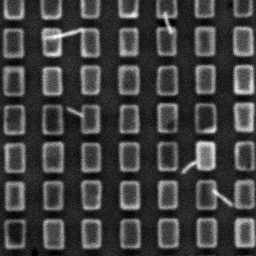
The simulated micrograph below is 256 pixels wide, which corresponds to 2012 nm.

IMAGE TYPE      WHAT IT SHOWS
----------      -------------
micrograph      wiring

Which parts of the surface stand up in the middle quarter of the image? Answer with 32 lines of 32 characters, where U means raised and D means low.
DDDDDDDDDDDDDDDDDDDDDDDDDDDDDDDD
DDDDDUUUUDDDDDUUUUUDDDDDUUUUDDDD
DDDDDUUUUDDDDDUUUUUDDDDDUUUUDDDD
DDDDDUUUUDDDDDUUUUUDDDDUUUUUDDDD
DDDDDUUUUDDDDDUUUUUDDDDUUUUUDDDD
DDDDDUUUUDDDDDUUUUUDDDDUUUUUDDDD
DDDDDUUUUDDDDDUUUUUDDDDUUUUUDDDD
DDDDDDDDDDDDDDDDDDDDDDDDUUUUDDDD
DDDDDDDDDDDDDDDDDDDDDDDDDDDDDDDD
DDDDDDDDDDDDDDDDDDDDDDDDDDDDDDDD
DDDDDUUUDDDDDDDUUUDDDDDDUUUUDDDD
DDDDDUUUUDDDDDUUUUDDDDDDUUUUDDDD
DDDDUUUUUDDDDDUUUUDDDDDDUUUUDDDD
DDDDDUUUUDDDDDUUUUUDDDDDUUUUDDDD
DDDDDUUUUDDDDDUUUUUDDDDDUUUUDDDD
DDDDDUUUUDDDDDUUUUUDDDDDUUUUDDDD
DDDDDUUUUDDDDDUUUUUDDDDDUUUUDDDD
DDDDDDDDDDDDDDDDDDDDDDDDDDDDDDDD
DDDDDDDDDDDDDDDDDDDDDDDDDDDDDDDD
DDDDDDDDDDDDDDDDDDDDDDDDDDDDDDDD
DDDDDUUUUDDDDDUUUUUDDDDDUUUUDDDD
DDDDDUUUUDDDDDUUUUUDDDDDUUUUDDDD
DDDDDUUUUDDDDDUUUUUDDDDDUUUUDDDD
DDDDDUUUUDDDDDUUUUUDDDDDUUUUDDDD
DDDDDUUUUDDDDDUUUUUDDDDDUUUUDDDD
DDDDDUUUUDDDDDUUUUUDDDDDUUUUDDDD
DDDDDUUUUDDDDDDUUUDDDDDDDDDDDDDD
DDDDDDDDDDDDDDDDDDDDDDDDDDDDDDDD
DDDDDDDDDDDDDDDDDDDDDDDDDDDDDDDD
DDDDDUUUUDDDDDDDDUDDDDDDUUUUDDDD
DDDDDUUUUDDDDDUUUUUDDDDDUUUUDDDD
DDDDDUUUUDDDDDUUUUUDDDDDUUUUDDDD